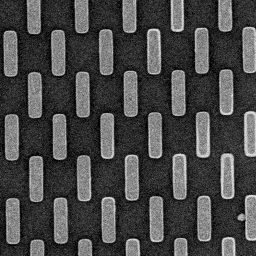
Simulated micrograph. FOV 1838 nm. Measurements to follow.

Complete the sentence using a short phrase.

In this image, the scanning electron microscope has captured groups of lines, slits or small figures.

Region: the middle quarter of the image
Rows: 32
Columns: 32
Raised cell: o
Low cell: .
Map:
.........ooo.........ooo........
.........ooo.........ooo........
...ooo....oo...ooo.........ooo..
...ooo.........ooo.........ooo..
...ooo.........ooo.........ooo..
...ooo.........ooo.........ooo..
...ooo.........ooo.........ooo..
...ooo.........ooo.........ooo..
...ooo.........ooo.........ooo..
...ooo.........ooo.........ooo..
...ooo.........ooo.........ooo..
...ooo.........ooo.........ooo..
...ooo....oo...ooo....oo...ooo..
.........ooo.........ooo........
.........ooo.........ooo........
.........ooo.........ooo........
.........ooo.........ooo........
.........ooo.........ooo........
.........ooo.........ooo........
.........ooo.........ooo........
.........ooo.........ooo........
.........ooo.........ooo........
.........ooo.........ooo........
....oo....oo....oo.........ooo..
....ooo........ooo.........ooo..
....ooo........ooo.........ooo..
....ooo........oooo........ooo..
....ooo........oooo........ooo..
....ooo........oooo........ooo..
....ooo........oooo........ooo..
....ooo........oooo........ooo..
....ooo........oooo........ooo..